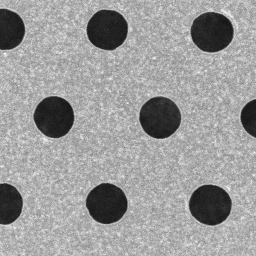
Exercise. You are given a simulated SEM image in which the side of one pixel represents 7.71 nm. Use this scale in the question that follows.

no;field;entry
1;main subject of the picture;holes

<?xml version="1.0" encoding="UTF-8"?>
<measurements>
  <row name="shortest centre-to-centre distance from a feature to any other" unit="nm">778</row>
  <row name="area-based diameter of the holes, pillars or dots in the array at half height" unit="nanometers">319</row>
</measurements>